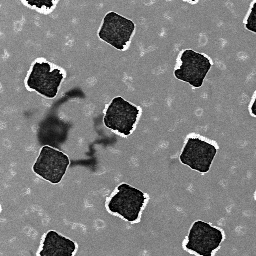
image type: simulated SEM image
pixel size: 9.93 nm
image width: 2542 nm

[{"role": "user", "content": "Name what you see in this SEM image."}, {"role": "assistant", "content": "holes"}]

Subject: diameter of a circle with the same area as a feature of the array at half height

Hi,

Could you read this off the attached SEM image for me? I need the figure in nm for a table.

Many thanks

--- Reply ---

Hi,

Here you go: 335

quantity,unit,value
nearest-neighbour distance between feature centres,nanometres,839